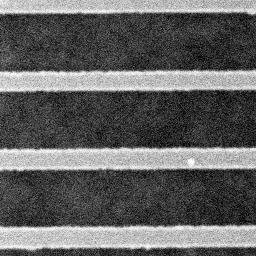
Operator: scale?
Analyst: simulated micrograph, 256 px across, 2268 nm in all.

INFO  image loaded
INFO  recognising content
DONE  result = lines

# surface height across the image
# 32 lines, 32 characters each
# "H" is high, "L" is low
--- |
HHHHHHHHHHHHHHHHHHHHHHHHHHHHHHHH
HHHHHHHHHLLLLLLLLLLLLLLLLLLLLLLH
LLLLLLLLLLLLLLLLLLLLLLLLLLLLLLLL
LLLLLLLLLLLLLLLLLLLLLLLLLLLLLLLL
LLLLLLLLLLLLLLLLLLLLLLLLLLLLLLLL
LLLLLLLLLLLLLLLLLLLLLLLLLLLLLLLL
LLLLLLLLLLLLLLLLLLLLLLLLLLLLLLLL
LLLLLLLLLLLLLLLLLLLLLLLLLLLLLLLL
LLLLLLLLLLLLLLLLLLLLLLLLLLLLLLLL
HHHHHHHHHHHHHHHHHHHHHHHHHHHHHHHH
HHHHHHHHHHHHHHHHHHHHHHHHHHHHHHHH
LLLLLLLLLLLLLLLLLLLLLLLLLLLLLLLL
LLLLLLLLLLLLLLLLLLLLLLLLLLLLLLLL
LLLLLLLLLLLLLLLLLLLLLLLLLLLLLLLL
LLLLLLLLLLLLLLLLLLLLLLLLLLLLLLLL
LLLLLLLLLLLLLLLLLLLLLLLLLLLLLLLL
LLLLLLLLLLLLLLLLLLLLLLLLLLLLLLLL
LLLLLLLLLLLLLLLLLLLLLLLLLLLLLLLL
LLLLLLLLLLLLLLLLLLLLLLLLLLLLLLLL
HHHHHHHHHHHHHHHHHHHHHHHHHHHHHHHH
HHHHHHHHHHHHHHHHHHHHHHHHHHHHHHHH
LLLLLLLLLLLLLLLLLLLLLLLLLLLLLLLL
LLLLLLLLLLLLLLLLLLLLLLLLLLLLLLLL
LLLLLLLLLLLLLLLLLLLLLLLLLLLLLLLL
LLLLLLLLLLLLLLLLLLLLLLLLLLLLLLLL
LLLLLLLLLLLLLLLLLLLLLLLLLLLLLLLL
LLLLLLLLLLLLLLLLLLLLLLLLLLLLLLLL
LLLLLLLLLLLLLLLLLLLLLLLLLLLLLLLL
LLLLLLLHHLHLHHLHHHHHHLHHHHHHHHHH
HHHHHHHHHHHHHHHHHHHHHHHHHHHHHHHH
HHHHHHHHHHHHHHHHHHHHHHHHHHHHHHHH
LLLLLLLLLLLLLLLLLLLLLLLLLLLLLLLL